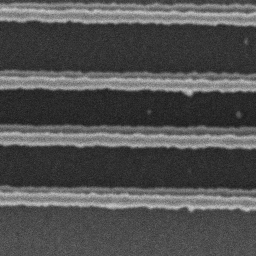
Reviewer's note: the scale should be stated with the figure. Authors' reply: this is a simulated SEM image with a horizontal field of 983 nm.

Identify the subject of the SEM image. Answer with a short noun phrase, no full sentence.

lines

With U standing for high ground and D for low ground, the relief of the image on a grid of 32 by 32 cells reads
DDUUUDDDUDDDDDDDDDDDDDDDDDDDDDDD
UUUUUUUUUUUUUUUUUUUUUUUUUUUUUUUU
UUUUUUUUUUUUUUUUUUUUUUUUUUUUUUUU
DDDDDDDDDDDDDDDDDDDDDDDDDDDDDDDD
DDDDDDDDDDDDDDDDDDDDDDDDDDDDDDDD
DDDDDDDDDDDDDDDDDDDDDDDDDDDDDDDD
DDDDDDDDDDDDDDDDDDDDDDDDDDDDDDDD
DDDDDDDDDDDDDDDDDDDDDDDDDDDDDDDD
DDDDDDDDDDDDDDDDDDDDDDDDDDDDDDDD
UUUUUUUUUUUUUUUUUUUUUUUUUUUUUUUU
UUUUUUUUUUUUUUUUUUUUUUUUUUUUUUUU
DDDDDDDDDDDDDDDDDDDDDDDUDDDDDDDD
DDDDDDDDDDDDDDDDDDDDDDDDDDDDDDDD
DDDDDDDDDDDDDDDDDDDDDDDDDDDDDDDD
DDDDDDDDDDDDDDDDDDDDDDDDDDDDDDDD
DDDDDDDDDDDDDDDDDDDDDDDDDDDDDDDD
UUUUUUUUUUUUUUUUUUUUUUUUUUUUUUUU
UUUUUUUUUUUUUUUUUUUUUUUUUUUUUUUU
DDDDDDDDDDDDDDDDDDDDDDDDUDDDUDDU
DDDDDDDDDDDDDDDDDDDDDDDDDDDDDDDD
DDDDDDDDDDDDDDDDDDDDDDDDDDDDDDDD
DDDDDDDDDDDDDDDDDDDDDDDDDDDDDDDD
DDDDDDDDDDDDDDDDDDDDDDDDDDDDDDDD
UUUUUUUDDDUDDDDDDDDDDDDDDDDDDDDD
UUUUUUUUUUUUUUUUUUUUUUUUUUUUUUUU
UUUUUUUUUUUUUUUUUUUUUUUUUUUUUUUU
DDDDDDDDDDDDDDDDDDDDDDDDDDDDDDDD
DDDDDDDDDDDDDDDDDDDDDDDDDDDDDDDD
DDDDDDDDDDDDDDDDDDDDDDDDDDDDDDDD
DDDDDDDDDDDDDDDDDDDDDDDDDDDDDDDD
DDDDDDDDDDDDDDDDDDDDDDDDDDDDDDDD
DDDDDDDDDDDDDDDDDDDDDDDDDDDDDDDD